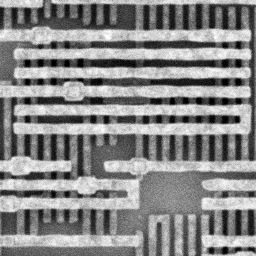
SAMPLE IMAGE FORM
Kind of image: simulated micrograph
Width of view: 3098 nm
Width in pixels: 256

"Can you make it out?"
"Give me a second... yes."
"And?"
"wiring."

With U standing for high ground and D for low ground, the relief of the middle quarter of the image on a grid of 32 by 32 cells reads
DDDDDDDDDDDDDDDDDDDDDDDDDDDDDDDD
UUUUUUUUUUUUUUUUUUUUUUUUUUUUUUUU
UUUUUUUUUUUUUUUUUUUUUUUUUUUUUUUU
DDDDDDUDDDDUUUDDDDDDUUUUUUUUUDDD
DDDDDDDDDDDDDDDDDDDDDDDDDDDDDDDD
UUUUUDDDDDDDDDDDDDDDDDDDDDDDDDDD
UUUUUUUUUUUUUUUUUUUUUUUUUUUUUUUU
UUUUUUUUUUUUUUUUUUUUUUUUUUUUUUUU
UUUUUDDDDDDDDDDDDDDDDDDDDDDDDDDD
DDDDDDDDDDDDDDDDDDDDDDDDDDDDDDDD
UUUUUUUUUUUUUUUDDDDUUUUUDUDDDUUU
UUUUUUUUUUUUUUUUUUUUUUUUUUUUUUUU
UUUUUUUUUUUUUUUUUUUUUUUUUUUUUUUU
DDDDDDDDDDDDDDDDDDDDDDDDDDDDDDDD
DDDDDDDDDDDDDDDDDDDDDDDDDDDDDDDD
UUUUUUUUUUUUUUUUUUUUUUUUUUUUUUUU
UUUUUUUUUUUUUUUUUUUUUUUUUUUUUUUU
DDDDDDDDDDDDDDDDDDDDDDDDDUUDDUUU
DDDDDDDDDDDDDDDDDDDDDDDDDDDDDDDD
DDDDDDDDDDDDDDDDDDDDDDDDDDDDDDDD
DDDDDDDDDDDDDDDDDDDDDDDDDDDDDDDD
DDDDDDDDDDDDDDDDDDDDDDDDDDDDDDDD
DDDDDDDDDDDDDDDDDDDDDDDDDDDDDDDD
DDDDDDDDDDDDDDDDDDDDDDDDDDDDDDDD
UDDDDDDDDDDUUUUUUUUUUDDDDDDUUUUD
UUDDDDDDDDUUUUUUUUUUUUUUUUUUUUUU
UDDDDDDDDDDUUUUUUUUUUUUUDUUUUUDD
DDDDDDDDDDDDDDDDDDDDDDDDDDDDDDDD
DDDDUUUUDDDDDDDDDDDDDDDDDDDDDDDD
UUUUUUUUUUUUUUUUUUDDDDDDDDDDDDDD
UUUUUUUUUUUUUUUUUUDDDDDDDDDDDDDD
DDDDUUUUDDDDDDDDUUDDDDDDDDDDDDDD